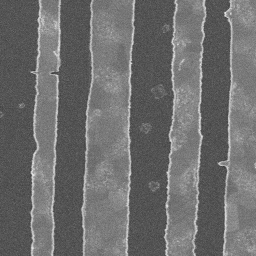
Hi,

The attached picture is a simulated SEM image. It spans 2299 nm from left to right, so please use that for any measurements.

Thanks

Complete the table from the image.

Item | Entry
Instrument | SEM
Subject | one or a few lines or trenches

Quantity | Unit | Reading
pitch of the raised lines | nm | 626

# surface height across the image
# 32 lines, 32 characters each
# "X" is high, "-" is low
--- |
-----XX----XXXXXX-----XXXX---XXX
-----XX----XXXXXX-----XXXX--XXXX
-----XX----XXXXXX-----XXXX---XXX
-----XX----XXXXXX-----XXX----XXX
-----XX----XXXXXX-----XXX----XXX
-----XX----XXXXXX-----XXX----XXX
-----XX----XXXXX------XXX----XXX
-----XX-----XXXX------XXX----XXX
-----XX-----XXXX------XXX----XXX
----XXX-----XXXX------XXX----XXX
-----XX----XXXXX------XXX----XXX
-----XX----XXXXX------XXX----XXX
-----XX----XXXXX-------XX----XXX
----XXX----XXXXX------XXX----XXX
----XXX----XXXXX------XXX----XXX
----XXX----XXXXX------XXX----XXX
----XXX----XXXXX-----XXXX----XXX
----XXX----XXXXX-----XXXX----XXX
-----XX----XXXXX-----XXXX----XXX
----XXX----XXXXX-----XXXX----XXX
----XXX----XXXXX-----XXXX---XXXX
----XXX----XXXXX-----XXXX---XXXX
----XXX----XXXXX-----XXXX---XXXX
----XXX----XXXXX-----XXXX---XXXX
----XXX----XXXXX-----XXXX---XXXX
----XXX---XXXXXX-----XXXX---XXXX
----XXX---XXXXXX-----XXXX---XXXX
----XXX---XXXXXX-----XXX----XXXX
----XXX---XXXXXX-----XXX----XXXX
----XXX----XXXXX-----XXX----XXXX
----XXX----XXXXX-----XXX----XXXX
----XXX---XXXXXX-----XXX----XXXX